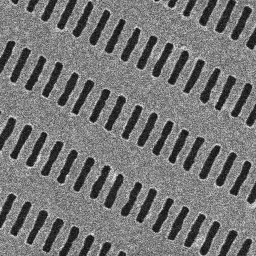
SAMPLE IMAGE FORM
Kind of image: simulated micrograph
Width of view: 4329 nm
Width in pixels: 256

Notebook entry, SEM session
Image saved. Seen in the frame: a regular array of holes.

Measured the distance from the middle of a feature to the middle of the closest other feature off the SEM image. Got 293 nm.